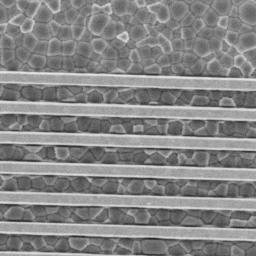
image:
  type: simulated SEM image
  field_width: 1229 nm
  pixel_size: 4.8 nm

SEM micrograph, parallel lines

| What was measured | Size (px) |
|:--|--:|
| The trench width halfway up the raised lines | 19.4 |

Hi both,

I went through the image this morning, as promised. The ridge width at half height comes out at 52.2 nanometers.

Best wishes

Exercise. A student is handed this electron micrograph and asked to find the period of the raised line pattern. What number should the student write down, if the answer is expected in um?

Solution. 0.144